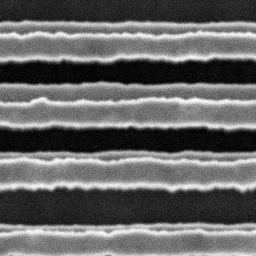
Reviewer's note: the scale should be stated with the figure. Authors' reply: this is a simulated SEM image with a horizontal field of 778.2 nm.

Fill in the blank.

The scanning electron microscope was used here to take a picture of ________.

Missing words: lines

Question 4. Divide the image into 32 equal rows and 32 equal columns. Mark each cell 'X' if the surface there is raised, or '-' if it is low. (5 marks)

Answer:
--------------------------------
--------------------------------
--------------------------------
XXXXXXXXXXXXXXXXXXXXXXXXXXXXXXXX
XXXXXXXXXXXXXXXXXXXXXXXXXXXXXXXX
XXXXXXXXXXXXXXXXXXXXXXXXXXXXXXXX
XXXXXXXXXXXXXXXXXXXXXXXXXXXXXXXX
X-X---X--XXXXX--------X---------
--------------------------------
--------------------------------
----------XXXXX-------X---------
XXXXXXXXXXXXXXXXXXXXXXXXXXXXXXXX
XXXXXXXXXXXXXXXXXXXXXXXXXXXXXXXX
XXXXXXXXXXXXXXXXXXXXXXXXXXXXXXXX
XXXXXXXXXXXXXXXXXXXXXXXXXXXXXXXX
XXXXXXXXXXXXXXXXXXXXXXXXXXXXXXXX
--------------------------------
--------------------------------
--------------------------------
XXXXXXXXXXXXXXXXXXXXXXXXXXXXXXXX
XXXXXXXXXXXXXXXXXXXXXXXXXXXXXXXX
XXXXXXXXXXXXXXXXXXXXXXXXXXXXXXXX
XXXXXXXXXXXXXXXXXXXXXXXXXXXXXXXX
---------------------X---X----X-
--------------------------------
--------------------------------
--------------------------------
--------------------------------
XXXXXXXXXXXXXXXXXXXXXXXXXXXXXXXX
XXXXXXXXXXXXXXXXXXXXXXXXXXXXXXXX
XXXXXXXXXXXXXXXXXXXXXXXXXXXXXXXX
XXXXXXXXXXXXXXXXXXXXXXXXXXXXXXXX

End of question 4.